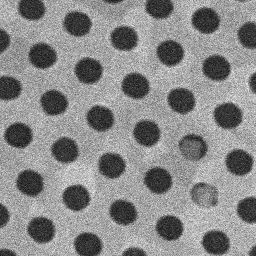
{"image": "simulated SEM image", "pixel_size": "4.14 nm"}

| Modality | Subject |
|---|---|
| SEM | a regular array of holes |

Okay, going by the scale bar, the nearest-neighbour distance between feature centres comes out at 197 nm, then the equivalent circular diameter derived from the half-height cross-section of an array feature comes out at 120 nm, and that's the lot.